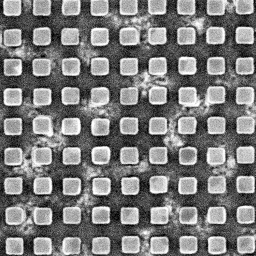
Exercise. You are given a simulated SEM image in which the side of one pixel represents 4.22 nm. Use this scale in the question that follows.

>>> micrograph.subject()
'a regular array of raised bodies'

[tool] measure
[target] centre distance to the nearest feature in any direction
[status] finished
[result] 0.122 µm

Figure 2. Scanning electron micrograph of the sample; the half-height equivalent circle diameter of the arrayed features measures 77.2 nm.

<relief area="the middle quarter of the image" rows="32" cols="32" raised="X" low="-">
XXXX---XXXX---XXXX---XXXX----XXX
XXXX---XXXX---XXXX---XXXX----XXX
XXX----XXXX---XXXX----XXX-------
--------------------------------
--------------------------------
--------------------------------
XXXX---XXXX---XXXX----XXX----XXX
XXXX---XXXX---XXXX---XXXX----XXX
XXXX---XXXX---XXXX---XXXX----XXX
XXXX---XXXX---XXXX----XXX----XXX
--------------------------------
--------------------------------
--------------------------------
--------------------------------
XXXX---XXXX---XXXX---XXXX----XXX
XXXX---XXXX---XXXX----XXX----XXX
XXXX---XXXX---XXXX----XXXX---XXX
-------XXXX---------------------
--------------------------------
--------------------------------
--------------------------------
XXXX---XXXX---XXXX----XXXX---XXX
XXXX---XXXX---XXXX----XXXX---XXX
XXXX---XXXX---XXXX----XXXX---XXX
XXXX---XXXX---XXXX----XXX----XXX
--------------------------------
--------------------------------
--------------------------------
----------------------XXX-------
XXXX---XXXX----XXXX---XXXX---XXX
XXXX---XXXX----XXXX---XXXX---XXX
XXXX---XXXX----XXXX---XXXX---XXX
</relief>